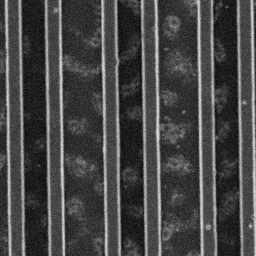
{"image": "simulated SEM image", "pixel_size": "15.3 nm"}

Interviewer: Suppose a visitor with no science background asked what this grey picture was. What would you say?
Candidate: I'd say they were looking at parallel lines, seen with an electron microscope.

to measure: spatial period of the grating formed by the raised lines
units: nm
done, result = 710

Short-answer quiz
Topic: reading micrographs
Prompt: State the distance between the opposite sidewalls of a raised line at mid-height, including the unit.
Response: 212 nanometers